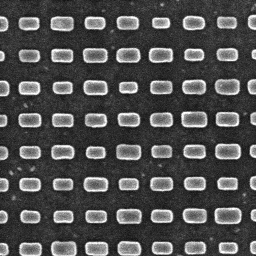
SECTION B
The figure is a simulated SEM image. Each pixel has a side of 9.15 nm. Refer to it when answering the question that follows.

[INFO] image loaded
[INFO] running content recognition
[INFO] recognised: a regular array of raised bodies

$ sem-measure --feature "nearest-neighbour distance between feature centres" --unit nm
294